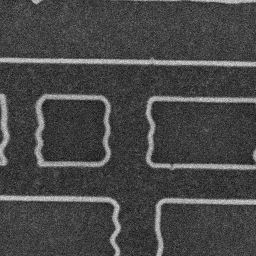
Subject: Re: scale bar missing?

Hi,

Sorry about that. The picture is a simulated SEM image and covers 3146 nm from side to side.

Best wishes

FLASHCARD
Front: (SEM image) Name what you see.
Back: one or a few lines or trenches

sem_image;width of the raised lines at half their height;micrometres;0.448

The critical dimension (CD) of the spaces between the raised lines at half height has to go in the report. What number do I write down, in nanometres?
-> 815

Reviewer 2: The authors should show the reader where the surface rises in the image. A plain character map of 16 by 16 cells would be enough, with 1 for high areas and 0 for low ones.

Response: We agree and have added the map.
0000000000000000
0000000000000000
0000000000000000
0000000000000000
1111111111111111
1111111111111111
1110000111000000
1110000110000000
1100000110000000
1100000110000000
1111111111111111
1111111111111111
0000001111111111
0000000111000000
0000000111000000
0000000111000000